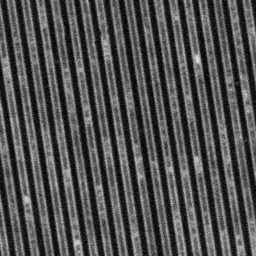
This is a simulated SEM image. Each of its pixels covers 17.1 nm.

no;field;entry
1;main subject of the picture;parallel lines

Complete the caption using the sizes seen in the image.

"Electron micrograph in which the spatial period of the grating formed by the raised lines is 249 nanometres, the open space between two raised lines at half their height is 135 nm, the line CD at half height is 106 nm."